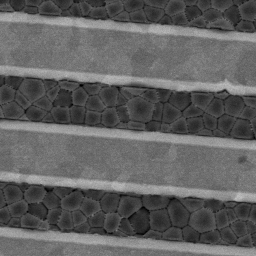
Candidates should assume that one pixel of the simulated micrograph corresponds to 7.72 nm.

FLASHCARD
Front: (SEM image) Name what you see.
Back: one or a few lines or trenches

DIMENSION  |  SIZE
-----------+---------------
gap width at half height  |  431 nm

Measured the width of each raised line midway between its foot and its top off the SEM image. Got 402 nm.